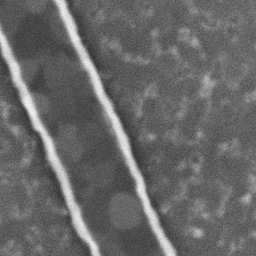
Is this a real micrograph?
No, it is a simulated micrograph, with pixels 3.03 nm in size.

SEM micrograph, one or a few lines or trenches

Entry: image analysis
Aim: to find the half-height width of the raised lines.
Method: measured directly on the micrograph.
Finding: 213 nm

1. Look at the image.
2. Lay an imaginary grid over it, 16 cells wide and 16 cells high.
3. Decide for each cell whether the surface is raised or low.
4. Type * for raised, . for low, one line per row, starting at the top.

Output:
****............
****............
*****...........
*****...........
.*****..........
.*****..........
..*****.........
..*****.........
...*****........
...*****........
....****........
....*****.......
....*****.......
.....****.......
.....*****......
......*****.....